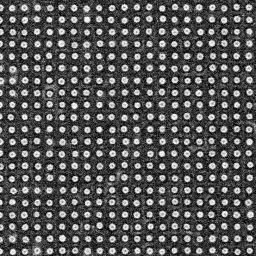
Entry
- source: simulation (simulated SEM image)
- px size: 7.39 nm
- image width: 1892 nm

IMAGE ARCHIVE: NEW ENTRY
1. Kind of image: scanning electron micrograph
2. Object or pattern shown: a regular array of raised bodies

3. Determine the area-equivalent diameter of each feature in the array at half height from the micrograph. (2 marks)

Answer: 0.0391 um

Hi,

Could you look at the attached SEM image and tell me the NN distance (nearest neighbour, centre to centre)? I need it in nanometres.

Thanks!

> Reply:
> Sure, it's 86.6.